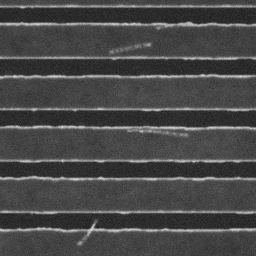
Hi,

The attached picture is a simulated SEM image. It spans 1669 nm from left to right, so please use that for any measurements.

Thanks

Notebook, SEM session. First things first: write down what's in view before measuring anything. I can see lines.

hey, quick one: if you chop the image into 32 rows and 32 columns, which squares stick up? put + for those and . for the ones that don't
++++++++++++++++++++++++++++++++
................................
................................
++++++++++++++++++++++++++++++++
++++++++++++++++++++++++++++++++
++++++++++++++++++++++++++++++++
++++++++++++++++++++++++++++++++
................................
................................
+++.+.++..+++++..+++++++++++++++
++++++++++++++++++++++++++++++++
++++++++++++++++++++++++++++++++
++++++++++++++++++++++++++++++++
++++++++++++++++++++++++++++++++
................................
................................
++++++++++++++++++++++++++++++++
++++++++++++++++++++++++++++++++
++++++++++++++++++++++++++++++++
++++++++++++++++++++++++++++++++
................................
................................
++++++++++++++++++++++++++++++++
++++++++++++++++++++++++++++++++
++++++++++++++++++++++++++++++++
++++++++++++++++++++++++++++++++
++++++++++++++++++++++++++++++++
................................
................................
++++++++++++++++++++++++++++++++
++++++++++++++++++++++++++++++++
++++++++++++++++++++++++++++++++